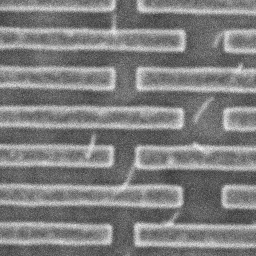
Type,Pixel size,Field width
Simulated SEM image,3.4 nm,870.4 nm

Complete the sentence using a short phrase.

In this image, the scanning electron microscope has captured wiring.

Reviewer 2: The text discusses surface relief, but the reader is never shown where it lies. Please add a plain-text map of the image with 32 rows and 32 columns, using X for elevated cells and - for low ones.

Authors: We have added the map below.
XXXXXXXXXXXXXX---XXXXXXXXXXXXXXX
------------------------------XX
--------------------------------
--------------------------------
XXXXXXXXXXXXXXXXXXXXXXX-----XXXX
XXXXXXXXXXXXXXXXXXXXXXX-----XXXX
--------------------------------
--------------------------------
--------------------------------
XXXXXXXXXXXXXX---XXXXXXXXXXXXXXX
XXXXXXXXXXXXXX---XXXXXXXXXXXXXXX
--------------------------------
--------------------------------
---XXXX-------------------------
XXXXXXXXXXXXXXXXXXXXXXX-----XXXX
XXXXXXXXXXXXXXXXXXXXXXX-----XXXX
--------------------------------
--------------------------------
XXXXXXXXXXXXXX---XXXXXXXXXXXXXX-
XXXXXXXXXXXXXX---XXXXXXXXXXXXXXX
XXXXXXXXXXXXXX---XXXXXXXXXXXXXXX
--------------------------------
--------------------------------
XXXXXXXXXXX----XXXXXXX------XXXX
XXXXXXXXXXXXXXXXXXXXXXX-----XXXX
---XX--------XXXXXXXXX------XXXX
--------------------------------
--------------------------------
XXXXXXXXXXXXXX---XXXXXXXXXXXXXXX
XXXXXXXXXXXXXX---XXXXXXXXXXXXXXX
-----------------XXXXXXXXXXXXXXX
--------------------------------